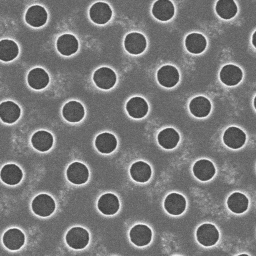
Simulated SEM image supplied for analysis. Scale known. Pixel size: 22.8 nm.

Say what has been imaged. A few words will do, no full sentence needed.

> a regular array of holes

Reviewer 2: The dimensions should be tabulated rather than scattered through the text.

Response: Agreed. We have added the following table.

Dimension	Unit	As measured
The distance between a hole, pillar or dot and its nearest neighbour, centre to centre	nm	1000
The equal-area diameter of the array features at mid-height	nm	512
